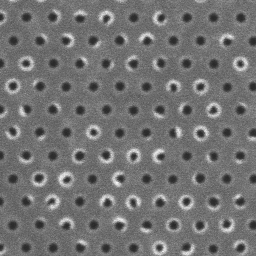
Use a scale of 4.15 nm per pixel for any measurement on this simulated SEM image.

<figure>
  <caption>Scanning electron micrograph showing a regular array of holes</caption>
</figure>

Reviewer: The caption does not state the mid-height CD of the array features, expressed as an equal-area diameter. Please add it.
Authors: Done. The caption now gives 37.4 nm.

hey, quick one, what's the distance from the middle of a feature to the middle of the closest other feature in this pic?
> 108 nm